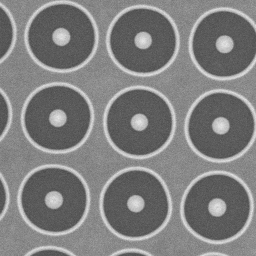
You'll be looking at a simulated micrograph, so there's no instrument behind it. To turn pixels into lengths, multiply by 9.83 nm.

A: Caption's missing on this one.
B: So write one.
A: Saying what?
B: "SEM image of an array of small figures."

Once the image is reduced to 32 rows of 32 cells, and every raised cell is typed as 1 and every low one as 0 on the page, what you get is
11111110011111111111111111111111
01111000000111110000111111000111
01110000000111000000011110000001
00110000000011000000001100000000
00100000000011000000001100000000
01100000000011000000001100000000
01110000000011000000001100000000
11111000000111000000011100000000
11111100011111100000111110000001
11111111111111111111111111000111
11111111111111111111111111111111
11110000001111100001111111101111
01110000000111000000011110000011
01100000000111000000011100000001
01100000000110000000001100000000
01100000000110000000001000000000
01100000000110000000001000000000
11110000001111000000011100000000
11111000011111100000111100000001
11111111111111111011111111000011
11111111111111111111111111111111
11110000011111100001111111111111
11100000001111000000111110000011
01100000000110000000011100000001
01100000000110000000011000000001
01100000000110000000011000000001
11100000000110000000011000000001
11100000001110000000011000000001
11110000011111000000111100000001
11111111111111100011111110000111
11111111111111111111111111111111
11110000111111100011111111111111